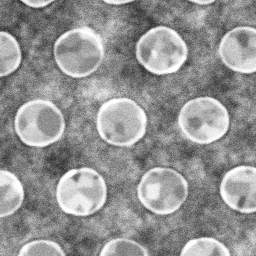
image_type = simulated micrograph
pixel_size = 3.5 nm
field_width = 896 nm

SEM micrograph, raised bodies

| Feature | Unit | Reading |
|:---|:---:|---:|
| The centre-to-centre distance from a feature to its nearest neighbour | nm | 281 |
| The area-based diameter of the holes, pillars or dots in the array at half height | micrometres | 0.162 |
